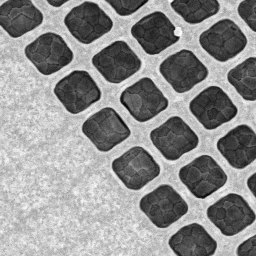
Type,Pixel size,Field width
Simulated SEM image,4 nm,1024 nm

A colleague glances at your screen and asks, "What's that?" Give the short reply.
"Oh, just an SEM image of a regular array of holes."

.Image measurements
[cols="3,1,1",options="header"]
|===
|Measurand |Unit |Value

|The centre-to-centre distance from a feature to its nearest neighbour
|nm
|189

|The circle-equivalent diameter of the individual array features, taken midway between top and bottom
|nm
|169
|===